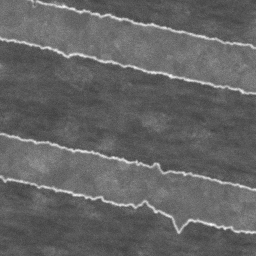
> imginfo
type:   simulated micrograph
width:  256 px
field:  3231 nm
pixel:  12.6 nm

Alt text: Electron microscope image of one or a few lines or trenches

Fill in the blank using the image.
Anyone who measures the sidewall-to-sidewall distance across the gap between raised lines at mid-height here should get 1.16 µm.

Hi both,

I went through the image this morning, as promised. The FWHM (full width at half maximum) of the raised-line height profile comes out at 562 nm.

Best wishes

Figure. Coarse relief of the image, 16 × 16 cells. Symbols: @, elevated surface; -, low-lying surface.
@@@@------------
@@@@@@@@@-------
@@@@@@@@@@@@@@--
-----@@@@@@@@@@@
---------@@@@@@@
--------------@@
----------------
----------------
@---------------
@@@@@@----------
@@@@@@@@@@------
--@@@@@@@@@@@@@-
------@@@@@@@@@@
----------@@@@@@
---------------@
----------------